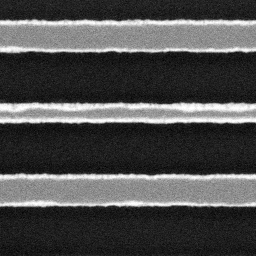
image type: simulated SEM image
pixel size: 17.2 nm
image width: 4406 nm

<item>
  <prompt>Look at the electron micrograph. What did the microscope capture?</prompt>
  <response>lines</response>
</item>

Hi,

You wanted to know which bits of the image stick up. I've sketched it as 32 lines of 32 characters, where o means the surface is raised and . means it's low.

................................
................................
................................
oooooooooooooooooooooooooooooooo
oooooooooooooooooooooooooooooooo
oooooooooooooooooooooooooooooooo
................................
................................
................................
................................
................................
................................
................................
oooooooooooooooooooooooooooooooo
oooooooooooooooooooooooooooooooo
................................
................................
................................
................................
................................
................................
................................
oooooooooooooooooooooooooooooooo
oooooooooooooooooooooooooooooooo
oooooooooooooooooooooooooooooooo
oooooooooooooooooooooooooooooooo
................................
................................
................................
................................
................................
................................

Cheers